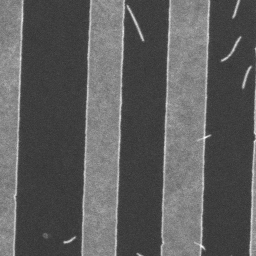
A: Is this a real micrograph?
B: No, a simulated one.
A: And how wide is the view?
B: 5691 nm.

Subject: one or a few lines or trenches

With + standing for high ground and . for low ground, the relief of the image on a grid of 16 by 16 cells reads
+.....++...++...
+.....++...++...
+.....++...++...
+.....++..+++...
+.....++..+++...
+....+++..+++...
+....+++..+++...
+....+++..+++...
+....+++..+++...
+....++...+++...
+....++...+++...
+....++...+++...
+....++...+++...
+....++...+++...
+....++...+++...
+....++...+++...